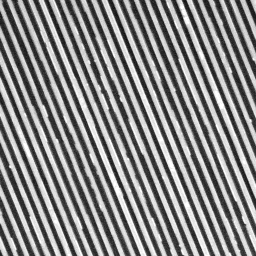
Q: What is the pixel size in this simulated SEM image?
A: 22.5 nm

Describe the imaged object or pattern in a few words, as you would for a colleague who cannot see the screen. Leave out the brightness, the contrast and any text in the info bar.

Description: parallel lines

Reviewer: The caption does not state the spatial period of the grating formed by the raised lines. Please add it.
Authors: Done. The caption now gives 222 nanometers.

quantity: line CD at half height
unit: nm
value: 91.4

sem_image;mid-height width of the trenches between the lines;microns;0.136